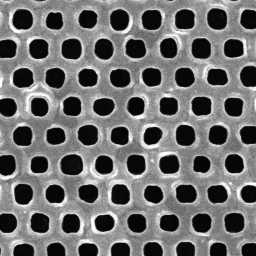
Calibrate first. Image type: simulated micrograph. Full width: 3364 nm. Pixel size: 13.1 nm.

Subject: a regular array of holes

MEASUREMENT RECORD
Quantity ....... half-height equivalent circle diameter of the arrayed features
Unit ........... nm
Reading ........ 260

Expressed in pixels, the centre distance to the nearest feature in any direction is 32.1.